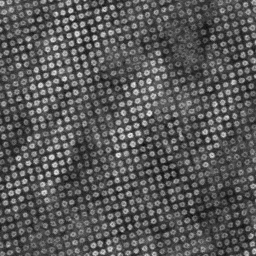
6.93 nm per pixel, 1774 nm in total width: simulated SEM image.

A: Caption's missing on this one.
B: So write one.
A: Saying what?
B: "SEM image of a regular array of raised bodies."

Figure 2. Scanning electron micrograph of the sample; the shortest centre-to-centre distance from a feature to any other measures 52.4 nanometers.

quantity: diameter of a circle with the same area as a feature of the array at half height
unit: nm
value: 33.2